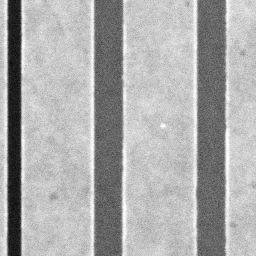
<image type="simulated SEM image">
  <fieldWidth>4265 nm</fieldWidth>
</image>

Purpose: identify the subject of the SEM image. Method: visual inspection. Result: lines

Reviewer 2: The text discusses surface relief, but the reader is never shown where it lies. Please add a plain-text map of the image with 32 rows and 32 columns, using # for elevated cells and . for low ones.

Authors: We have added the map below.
#..#########....########....####
#..#########....########....####
#..#########....########....####
#..#########....########....####
#..#########....########....####
#..#########....########....####
#..#########....########....####
#..#########....########....####
#..#########....########....####
#..#########....########....####
#..#########....########....####
#..#########....########....####
#..#########....########....####
#..#########....########....####
#..#########....########....####
#..#########....########....####
#..#########....########....####
#..#########....########....####
#..#########...#########....####
#..#########....########....####
#..#########...#########....####
#..#########....########....####
#..#########...#########....####
#..#########...#########....####
#..#########...#########....####
#..#########...#########....####
#..#########...#########....####
#..#########...#########....####
#..#########...#########....####
#..#########...#########....####
#..#########...#########....####
#..#########...#########....####